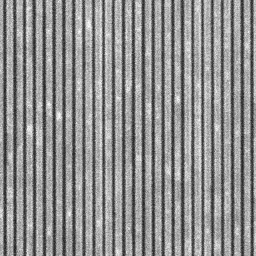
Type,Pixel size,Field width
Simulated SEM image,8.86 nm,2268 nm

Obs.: parallel lines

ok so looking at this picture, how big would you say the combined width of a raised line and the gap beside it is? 87.5 nm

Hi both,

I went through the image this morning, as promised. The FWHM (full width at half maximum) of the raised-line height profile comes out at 52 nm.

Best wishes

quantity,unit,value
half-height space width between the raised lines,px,4